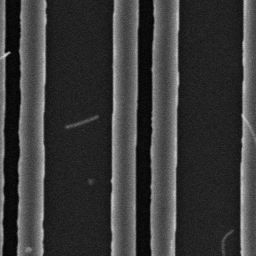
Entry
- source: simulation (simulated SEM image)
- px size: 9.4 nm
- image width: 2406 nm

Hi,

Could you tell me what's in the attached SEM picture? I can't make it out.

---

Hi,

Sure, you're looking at lines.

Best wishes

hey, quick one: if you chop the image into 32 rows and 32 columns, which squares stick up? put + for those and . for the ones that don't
+..+++........+++..+++.........+
+..+++........+++..+++.........+
+..+++........+++..+++.........+
+..+++........+++..+++.........+
+..+++........+++..+++.........+
+..+++........+++..+++........++
+.++++........+++..+++........++
+..+++........+++..+++........++
+..+++........+++..+++........++
+..+++........+++..+++.........+
+..+++........+++..+++........++
+..++.........+++..+++........++
+..++.........+++..+++........++
+..++.........+++..+++........++
..+++.........+++..+++........++
..+++.........+++..+++........++
..+++.........+++..+++........++
..+++.........+++..+++........++
..+++.........+++..+++........++
..+++.........+++..+++........++
..+++.........+++..+++........++
..+++.........+++..+++........++
..+++.........+++..+++........++
..+++.........+++..+++........++
..+++.........+++..+++........++
..+++.........+++..+++........++
..+++.........+++..+++........++
..+++.........+++..+++........++
..+++.........+++..+++........++
..+++.........+++..+++........++
..+++.........+++..+++........++
..+++.........+++..+++........++